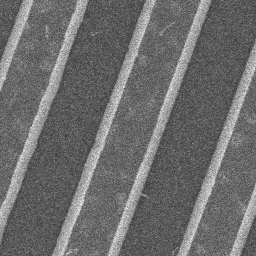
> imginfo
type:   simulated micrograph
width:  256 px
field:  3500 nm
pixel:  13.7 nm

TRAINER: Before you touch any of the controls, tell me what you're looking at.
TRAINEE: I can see one or a few lines or trenches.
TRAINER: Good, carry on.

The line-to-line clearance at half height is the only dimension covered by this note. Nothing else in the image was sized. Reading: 0.853 micrometres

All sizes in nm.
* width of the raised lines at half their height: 729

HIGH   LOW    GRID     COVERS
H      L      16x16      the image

LLHHHLLLLHHHHLLL
LHHHHLLLLHHHLLLL
LHHHLLLLHHHHLLLL
HHHHLLLLHHHHLLLL
HHHHLLLLHHHLLLLL
HHHLLLLHHHHLLLLH
HHHLLLLHHHHLLLLH
HHHLLLLHHHLLLLHH
HHLLLLHHHHLLLLHH
HHLLLLHHHHLLLLHH
HLLLLLHHHLLLLHHH
HLLLLHHHHLLLLHHH
HLLLLHHHLLLLLHHH
LLLLHHHHLLLLHHHH
LLLLHHHHLLLLHHHL
LLLLHHHLLLLHHHHL